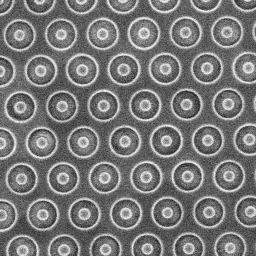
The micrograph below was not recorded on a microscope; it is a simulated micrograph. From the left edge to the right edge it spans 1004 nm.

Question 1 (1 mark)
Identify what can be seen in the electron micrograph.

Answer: an array of small figures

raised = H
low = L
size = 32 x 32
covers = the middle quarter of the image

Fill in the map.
HLLLHLLLHHHLLLHHLLLHHHLLHHLLLHHH
HLLHHHLLHHHLLLHHLLLHHLLLHHLLLHHH
HLLLHLLLHHHLLLHHLLLHHHLLLLLLLHHH
HLLLLLLLHHHHLLLLLLHHHHLLLLLLHHHH
HHLLLLLHHHHHHLLLLHHHHHHHLLLHHHHH
HHHHHHHHHHHHHHHHHHHHHHHHHHHHHHHH
HHHHHHHHHHHHHHHHHHHHHHHHHHHHHHLH
LHHHHHHHLLLLHHHHHHLLLLLHHHHHLLLL
LLHHHHHLLLLLLHHHHLLLLLLHHHHLLLLL
LLLHHHLLLHHLLHHHHLLHHLLLHHHLLLHH
HLLHHHLLLHHLLLHHHLLHHLLLHHHLLHHH
LLLHHHLLLHHLLHHHHLLLLLLLHHHLLLLL
LLLHHHHLLLLLLHHHHLLLLLLHHHHHLLLL
LLHHHHHHLLLLHHHHHHLLLLHHHHHHHLLL
HHHHHHHHHHHHHHHHHHHHHHHHHHHHHHHH
HHHHHHHHHHHHHHHHHHHHHHHHHLHHHHHH
HHHLLLLHHHHHHLLLLHHHHHHLLLLLHHHH
HHLLLLLLHHHHLLLLLLHHHHLLLLLLLHHH
HLLLHLLLHHHHLLHHLLLHHHLLLHLLLHHH
HLLLHHLLHHHHLLHHLLLHHHLLHHHLLHHH
HLLLHHLLHHHHLLLHLLLHHHLLLLLLLHHH
HHLLLLLLHHHHLLLLLLHHHHLLLLLLLHHH
HHHLLLLHHHHHHLLLLHHHHHHHLLLLHHHH
HHHHHHHHHHHHHHHHHHHHHHHHHHHHHHHH
HHHHHHHHHHHHHHHHHHHHHHHHHHHHHHLH
LLHHHHHHLLLLHHHHHHLLLLLHHHHHLLLL
LLLHHHHLLLLLLHHHHLLLLLLLHHHHLLLL
HLLHHHHLLHHLLLHHHLLLHHLLHHHLLLHH
HLLHHHLLLHHLLLHHHLLHHHLLHHHLLLHH
HLLHHHHLLHHLLLHHHLLLHLLLHHHLLLLL
LLLHHHHLLLLLLHHHHHLLLLLHHHHHLLLL
LLHHHHHHLLLLHHHHHHHLLLHHHHHHHLLL